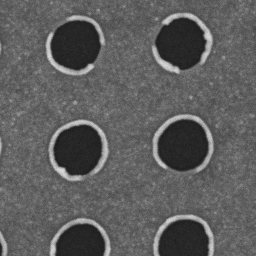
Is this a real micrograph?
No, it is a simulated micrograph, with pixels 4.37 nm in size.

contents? holes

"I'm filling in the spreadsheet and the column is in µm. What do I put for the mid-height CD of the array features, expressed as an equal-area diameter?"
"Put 0.218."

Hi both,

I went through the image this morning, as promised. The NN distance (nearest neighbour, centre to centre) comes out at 453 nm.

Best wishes